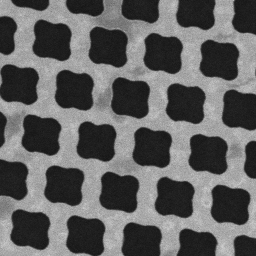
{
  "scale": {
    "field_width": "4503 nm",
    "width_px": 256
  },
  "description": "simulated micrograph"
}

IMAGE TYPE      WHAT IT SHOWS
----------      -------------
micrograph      a regular array of holes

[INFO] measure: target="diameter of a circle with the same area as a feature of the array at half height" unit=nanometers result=718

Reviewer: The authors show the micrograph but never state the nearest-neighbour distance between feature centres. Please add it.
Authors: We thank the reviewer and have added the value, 966 nm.